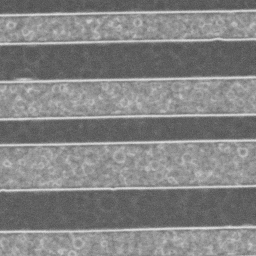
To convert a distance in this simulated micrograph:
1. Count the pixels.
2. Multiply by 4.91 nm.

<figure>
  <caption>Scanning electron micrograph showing one or a few lines or trenches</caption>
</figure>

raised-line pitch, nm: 364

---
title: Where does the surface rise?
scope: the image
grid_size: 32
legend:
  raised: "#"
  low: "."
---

################################
#######################.........
................................
................................
................................
.###############################
################################
################################
################################
################################
................................
................................
................................
................................
..................##############
################################
################################
################################
................................
..............##................
...................#............
................................
................................
.................###############
################################
################################
################################
################################
##########################.##...
................................
.........#......................
................................